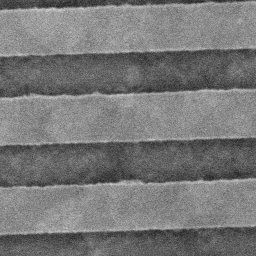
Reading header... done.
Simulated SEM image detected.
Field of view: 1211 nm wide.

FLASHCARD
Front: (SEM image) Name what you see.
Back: lines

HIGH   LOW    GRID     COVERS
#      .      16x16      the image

.....###########
################
################
#...............
................
................
################
################
################
................
................
......##########
################
################
#####...........
................